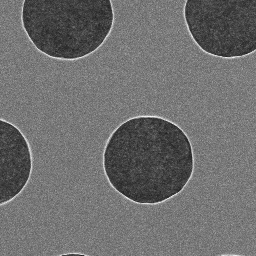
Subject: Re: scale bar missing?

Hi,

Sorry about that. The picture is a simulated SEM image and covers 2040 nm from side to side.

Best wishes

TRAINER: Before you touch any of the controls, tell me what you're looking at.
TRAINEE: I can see holes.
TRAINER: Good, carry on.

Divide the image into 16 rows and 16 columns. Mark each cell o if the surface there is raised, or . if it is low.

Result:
o......ooooo....
oo.....ooooo....
oo....oooooo....
ooo..ooooooooo.o
oooooooooooooooo
oooooooooooooooo
oooooooooooooooo
oooooooo..oooooo
.oooooo.....oooo
..ooooo.....oooo
..ooooo.....oooo
..ooooo.....oooo
.ooooooo..oooooo
oooooooooooooooo
oooooooooooooooo
oooooooooooooooo